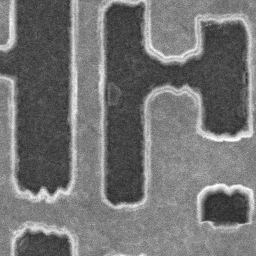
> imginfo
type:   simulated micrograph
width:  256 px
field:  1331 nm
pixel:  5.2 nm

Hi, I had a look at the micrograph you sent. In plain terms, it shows one or a few lines or trenches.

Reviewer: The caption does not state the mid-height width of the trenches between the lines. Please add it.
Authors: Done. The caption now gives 257 nanometers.